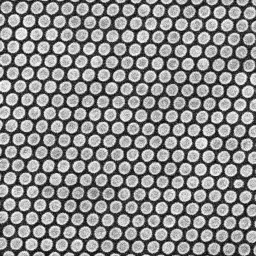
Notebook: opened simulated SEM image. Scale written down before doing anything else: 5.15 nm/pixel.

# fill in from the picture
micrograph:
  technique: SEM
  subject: a regular array of raised bodies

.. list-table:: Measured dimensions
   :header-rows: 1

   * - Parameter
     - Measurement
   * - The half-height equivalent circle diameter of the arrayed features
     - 59.6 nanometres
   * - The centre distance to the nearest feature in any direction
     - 76.6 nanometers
